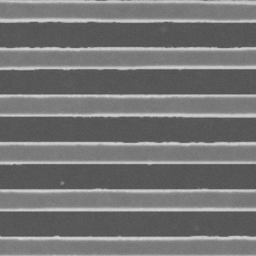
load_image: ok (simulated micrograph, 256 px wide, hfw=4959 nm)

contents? lines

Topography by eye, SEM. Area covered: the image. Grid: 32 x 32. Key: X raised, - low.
XXXXXXXXXXXXXXXXXXXXXXXXXXXXXXXX
XXXXXXXXXXXXXXXXXXXXXXXXXXXXXXXX
XXXXXXXXXXXXXXXXXXXXXXXXXXXXXXXX
--------------------------------
--------------------------------
--------------------------------
XXXXXXXXXXXXXXXXXXXXXXXXXXXXXXXX
XXXXXXXXXXXXXXXXXXXXXXXXXXXXXXXX
XXXXXXXXXXXXXXXXXXX---X----XX-X-
--------------------------------
--------------------------------
--------------------------------
XXXXXXXXXXXXXXXXXXXXXXXXXXXXXXXX
XXXXXXXXXXXXXXXXXXXXXXXXXXXXXXXX
--------------------------------
--------------------------------
--------------------------------
--------------------------------
XXXXXXXXXXXXXXXXXXXXXXXXXXXXXXXX
XXXXXXXXXXXXXXXXXXXXXXXXXXXXXXXX
--------------------------------
--------------------------------
--------------------------------
--------------------------------
XXXXXXXXXXXXXXXXXXXXXXXXXXXXXXXX
XXXXXXXXXXXXXXXXXXXXXXXXXXXXXXXX
--------------------------------
--------------------------------
--------------------------------
--------------------------------
XXXXXXXXXXXXXXXXXXXXXXXXXXXXXXXX
XXXXXXXXXXXXXXXXXXXXXXXXXXXXXXXX